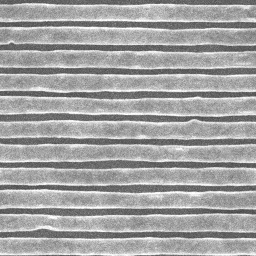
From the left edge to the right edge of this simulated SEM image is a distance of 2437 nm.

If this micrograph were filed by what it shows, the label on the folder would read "parallel lines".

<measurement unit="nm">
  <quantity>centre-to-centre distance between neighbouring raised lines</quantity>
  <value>222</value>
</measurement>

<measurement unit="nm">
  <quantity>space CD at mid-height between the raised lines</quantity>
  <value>67.8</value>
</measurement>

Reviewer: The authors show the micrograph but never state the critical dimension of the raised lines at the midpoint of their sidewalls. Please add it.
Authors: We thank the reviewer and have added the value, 153 nanometers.